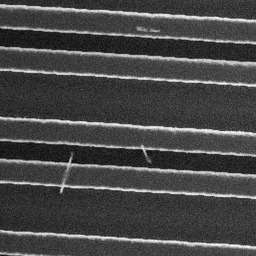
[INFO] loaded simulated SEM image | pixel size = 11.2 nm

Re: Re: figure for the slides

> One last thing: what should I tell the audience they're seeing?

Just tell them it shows lines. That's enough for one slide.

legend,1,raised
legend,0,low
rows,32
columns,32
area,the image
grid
00000000000000000000000000000000
11111111111111100000000000000000
11111111111111111111111111111110
11111111111111111111111111111111
00000000000000001111111111111111
00000000000000000000000000000000
11111111110000000000000000000000
11111111111111111111111111000000
11111111111111111111111111111111
00000000000011111111111111111111
00000000000000000000000000000111
00000000000000000000000000000000
00000000000000000000000000000000
00000000000000000000000000000000
00000000000000000000000000000000
11111111111111100000000000000000
11111111111111111111111111111100
11111111111111111111111111111111
00000000000000001111111111111111
00000000000000000000000000000001
11111111100000000000000000000000
11111111111111111111111111100000
11111111111111111111111111111111
00000000000011111111111111111111
00000000000000000000000000011111
00000000000000000000000000000000
00000000000000000000000000000000
00000000000000000000000000000000
00000000000000000000000000000000
11111111110000000000000000000000
11111111111111111111111111000000
11111111111111111111111111111111